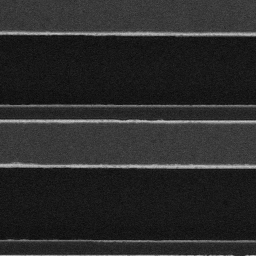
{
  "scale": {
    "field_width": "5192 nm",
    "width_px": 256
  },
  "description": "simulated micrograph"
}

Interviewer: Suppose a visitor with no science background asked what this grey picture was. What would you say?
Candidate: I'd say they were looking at lines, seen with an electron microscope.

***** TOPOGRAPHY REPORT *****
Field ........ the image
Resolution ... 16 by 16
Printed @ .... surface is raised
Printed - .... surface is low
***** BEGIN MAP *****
@@@@@@@@@@@@@@@@
@@@@@@@@@@@@@@@@
----------------
----------------
----------------
----------------
----------------
@@@@@@@@@@@@@@@@
@@@@@@@@@@@@@@@@
@@@@@@@@@@@@@@@@
---------------@
----------------
----------------
----------------
----------------
@@@@@@@@@@@@@@@@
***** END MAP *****